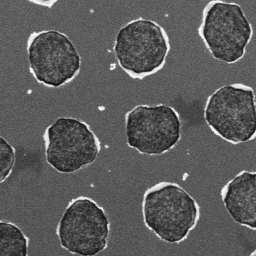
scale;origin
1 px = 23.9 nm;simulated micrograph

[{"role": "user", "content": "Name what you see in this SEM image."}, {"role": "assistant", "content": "holes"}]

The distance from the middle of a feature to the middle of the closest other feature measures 2.01 µm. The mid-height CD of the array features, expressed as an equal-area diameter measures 1240 nm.